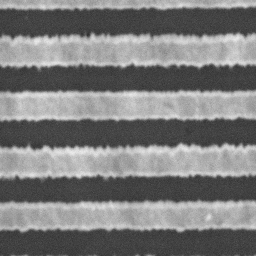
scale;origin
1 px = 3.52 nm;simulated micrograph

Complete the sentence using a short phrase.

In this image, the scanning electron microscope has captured lines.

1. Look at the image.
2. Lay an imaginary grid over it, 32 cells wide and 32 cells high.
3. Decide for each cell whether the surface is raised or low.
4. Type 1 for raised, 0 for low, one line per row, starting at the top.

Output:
11111111111111111111111111111111
00000000000000000000000000000000
00000000000000000000000000000000
00000000000000000000000000000000
00000000010110011010111000011101
11111111111111111111111111111111
11111111111111111111111111111111
11111111111111111111111111111111
00000000000000000000000000000000
00000000000000000000000000000000
00000000000000000000000000000000
00000000000000000000001010000001
11111111111111111111111111111111
11111111111111111111111111111111
11111111111111111111111111111111
00000000000000000000000000000000
00000000000000000000000000000000
00000000000000000000000000000000
11010100001000011111101110111111
11111111111111111111111111111111
11111111111111111111111111111111
11111111111111111111111111111111
00000000000000000000000000000000
00000000000000000000000000000000
00000000000000000000000000000000
11111111111111111111111111111111
11111111111111111111111111111111
11111111111111111111111111111111
11111111111111111111111111111111
00000000000000000000000000000000
00000000000000000000000000000000
00000000000000000000000000000000